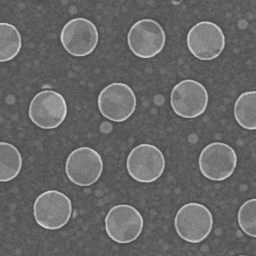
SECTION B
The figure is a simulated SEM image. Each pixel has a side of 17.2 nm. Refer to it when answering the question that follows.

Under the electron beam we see a regular array of raised bodies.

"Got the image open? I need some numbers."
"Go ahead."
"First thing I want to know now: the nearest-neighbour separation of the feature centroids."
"1090 nanometers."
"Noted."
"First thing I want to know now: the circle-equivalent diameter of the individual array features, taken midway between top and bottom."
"36.6 px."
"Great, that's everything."